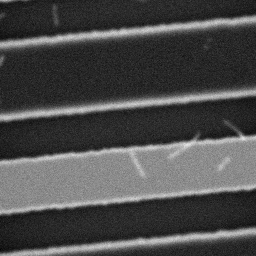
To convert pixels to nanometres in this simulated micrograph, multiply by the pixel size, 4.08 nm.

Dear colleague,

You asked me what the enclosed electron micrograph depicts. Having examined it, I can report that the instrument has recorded lines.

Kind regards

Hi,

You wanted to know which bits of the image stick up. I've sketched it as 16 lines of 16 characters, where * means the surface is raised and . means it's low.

................
...........*****
.***************
****************
****************
****************
**********......
................
................
......**********
****************
****************
*********.......
................
..............**
...*************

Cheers